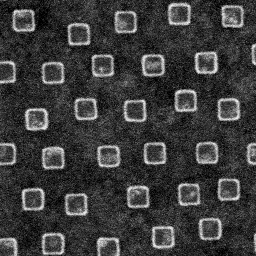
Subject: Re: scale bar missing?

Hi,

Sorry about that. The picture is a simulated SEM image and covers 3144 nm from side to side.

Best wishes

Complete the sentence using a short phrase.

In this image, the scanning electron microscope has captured a regular array of raised bodies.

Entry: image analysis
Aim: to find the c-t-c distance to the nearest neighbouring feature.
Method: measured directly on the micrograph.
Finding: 554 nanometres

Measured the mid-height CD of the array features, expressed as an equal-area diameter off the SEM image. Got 273 nm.